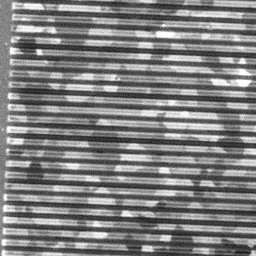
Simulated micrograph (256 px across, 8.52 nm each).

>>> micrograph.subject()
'parallel lines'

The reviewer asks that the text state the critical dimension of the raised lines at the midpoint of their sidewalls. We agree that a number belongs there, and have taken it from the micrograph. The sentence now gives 42.5 nm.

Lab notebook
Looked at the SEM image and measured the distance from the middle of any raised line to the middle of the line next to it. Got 0.0961 microns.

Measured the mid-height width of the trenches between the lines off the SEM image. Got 0.051 micrometres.